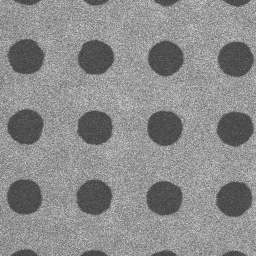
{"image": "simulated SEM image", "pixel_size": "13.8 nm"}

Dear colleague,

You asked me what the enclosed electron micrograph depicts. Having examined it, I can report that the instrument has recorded a regular array of holes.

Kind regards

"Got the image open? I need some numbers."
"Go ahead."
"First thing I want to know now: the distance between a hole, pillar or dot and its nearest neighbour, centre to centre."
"957 nanometres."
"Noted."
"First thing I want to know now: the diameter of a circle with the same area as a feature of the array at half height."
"484 nm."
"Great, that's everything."